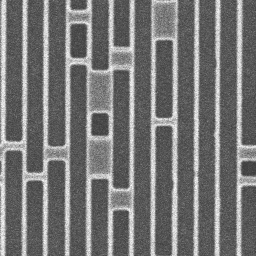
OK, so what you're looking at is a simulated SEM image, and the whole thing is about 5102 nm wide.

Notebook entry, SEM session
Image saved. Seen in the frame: parallel lines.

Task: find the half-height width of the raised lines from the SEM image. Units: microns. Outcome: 0.0723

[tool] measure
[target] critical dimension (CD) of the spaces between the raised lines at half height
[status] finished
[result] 349 nm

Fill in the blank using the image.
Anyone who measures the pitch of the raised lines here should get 21.5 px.